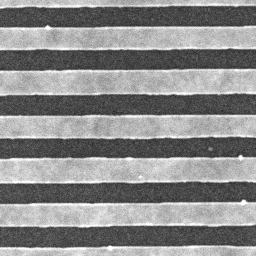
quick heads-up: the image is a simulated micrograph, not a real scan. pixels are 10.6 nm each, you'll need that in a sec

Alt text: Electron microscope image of lines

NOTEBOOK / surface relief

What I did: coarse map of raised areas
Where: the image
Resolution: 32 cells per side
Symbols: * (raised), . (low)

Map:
********************************
................................
................................
.....**.....********************
********************************
********************************
................................
................................
................................
********************************
********************************
********************************
................................
................................
..........**********************
********************************
********************************
................................
................................
................................
********************************
********************************
********************************
................................
................................
...*****************************
********************************
********************************
................................
................................
................................
********************************